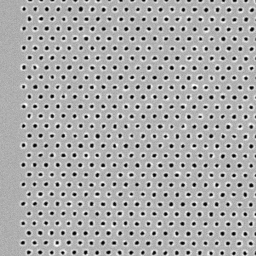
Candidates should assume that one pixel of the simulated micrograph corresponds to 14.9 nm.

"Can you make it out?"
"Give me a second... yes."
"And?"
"a regular array of holes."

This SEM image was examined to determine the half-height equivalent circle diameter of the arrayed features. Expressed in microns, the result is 0.0652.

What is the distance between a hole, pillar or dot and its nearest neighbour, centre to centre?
164 nm